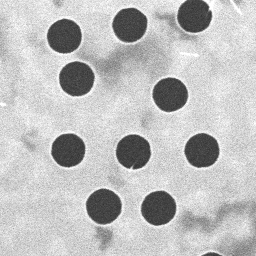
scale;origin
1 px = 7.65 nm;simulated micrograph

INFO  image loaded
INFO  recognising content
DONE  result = a regular array of holes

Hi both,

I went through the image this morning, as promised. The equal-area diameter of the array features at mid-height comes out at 0.267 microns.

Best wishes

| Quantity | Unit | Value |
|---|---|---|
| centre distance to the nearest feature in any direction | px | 61.9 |